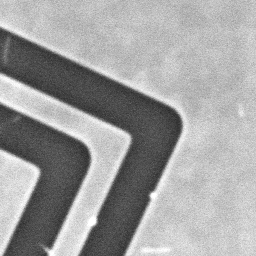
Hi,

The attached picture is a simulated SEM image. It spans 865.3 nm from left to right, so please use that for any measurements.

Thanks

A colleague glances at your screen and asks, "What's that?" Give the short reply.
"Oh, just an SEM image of groups of lines, slits or small figures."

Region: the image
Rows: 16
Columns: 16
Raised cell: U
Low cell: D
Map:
UUUUUUUUUUUUUUUU
UUUUUUUUUUUUUUUU
DDUUUUUUUUUUUUUU
DDDDUUUUUUUUUUUU
DDDDDDUUUUUUUUUU
UUDDDDDDUUUUUUUU
UUUUDDDDDDUUUUUU
DDUUUUDDDDDUUUUU
DDDDUUUUDDDUUUUU
DDDDDDUUDDDUUUUU
UUDDDDUDDDUUUUUU
UUDDDUUDDDUUUUUU
UUDDDUDDDUUUUUUU
UDDDUUDDDUUUUUUU
UDDDUUDDDUUUUUUU
DDDUUDDDUUUUUUUU